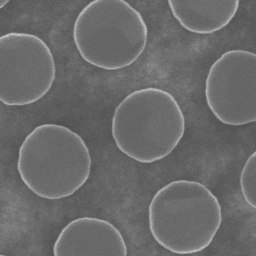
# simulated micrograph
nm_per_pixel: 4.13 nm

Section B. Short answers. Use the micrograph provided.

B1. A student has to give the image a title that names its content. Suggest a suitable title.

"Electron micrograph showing raised bodies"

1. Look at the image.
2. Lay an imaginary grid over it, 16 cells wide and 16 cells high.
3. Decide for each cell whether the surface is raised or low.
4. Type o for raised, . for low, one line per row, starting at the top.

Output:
.....ooo...oooo.
.....oooo..ooo..
ooo..oooo.......
ooo..oooo.....oo
ooo..........ooo
ooo..........ooo
.o......ooo..ooo
.......oooo...oo
..ooo..oooo.....
.ooooo..ooo.....
.ooooo.........o
..ooo......o...o
..........oooo.o
.........ooooo..
....ooo...ooo...
...ooooo..ooo...